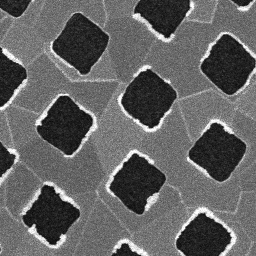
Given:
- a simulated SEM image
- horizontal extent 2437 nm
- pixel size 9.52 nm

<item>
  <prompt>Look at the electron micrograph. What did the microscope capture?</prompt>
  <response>holes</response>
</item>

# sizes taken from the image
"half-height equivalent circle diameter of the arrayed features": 487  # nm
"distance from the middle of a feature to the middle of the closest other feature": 814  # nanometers